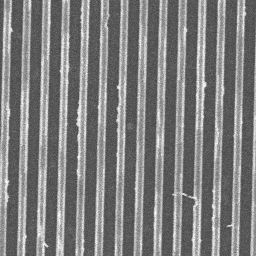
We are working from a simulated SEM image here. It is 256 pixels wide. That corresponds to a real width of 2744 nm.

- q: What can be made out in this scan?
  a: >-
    parallel lines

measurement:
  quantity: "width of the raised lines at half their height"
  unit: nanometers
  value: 72.4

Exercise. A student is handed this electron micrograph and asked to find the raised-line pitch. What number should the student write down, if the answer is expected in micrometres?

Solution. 0.208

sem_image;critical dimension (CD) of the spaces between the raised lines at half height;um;0.137